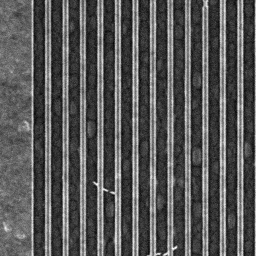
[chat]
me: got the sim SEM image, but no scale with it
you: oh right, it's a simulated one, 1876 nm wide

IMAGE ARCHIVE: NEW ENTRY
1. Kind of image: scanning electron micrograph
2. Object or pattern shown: parallel lines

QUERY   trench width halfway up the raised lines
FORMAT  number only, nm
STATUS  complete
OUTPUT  98.1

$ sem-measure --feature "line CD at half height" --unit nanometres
31.2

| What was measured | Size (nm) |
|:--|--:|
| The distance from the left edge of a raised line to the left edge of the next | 128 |